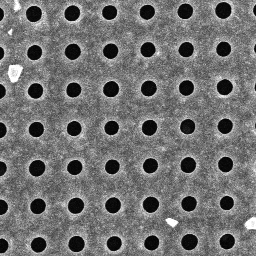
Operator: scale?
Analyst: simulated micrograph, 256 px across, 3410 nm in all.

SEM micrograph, a regular array of holes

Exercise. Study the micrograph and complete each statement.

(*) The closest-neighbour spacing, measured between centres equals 500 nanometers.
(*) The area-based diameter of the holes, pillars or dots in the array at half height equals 0.206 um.